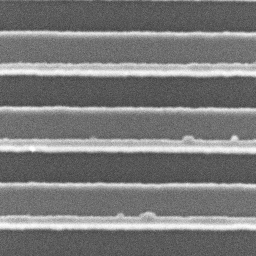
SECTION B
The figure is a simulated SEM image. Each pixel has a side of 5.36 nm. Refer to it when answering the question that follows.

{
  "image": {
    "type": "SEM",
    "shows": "lines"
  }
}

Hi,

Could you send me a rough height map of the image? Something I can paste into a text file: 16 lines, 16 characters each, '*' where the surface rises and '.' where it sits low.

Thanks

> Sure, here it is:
................
................
****************
****************
****************
................
................
****************
****************
................
................
.**.............
****************
****************
................
................